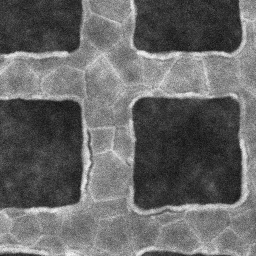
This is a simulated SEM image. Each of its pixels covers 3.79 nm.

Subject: holes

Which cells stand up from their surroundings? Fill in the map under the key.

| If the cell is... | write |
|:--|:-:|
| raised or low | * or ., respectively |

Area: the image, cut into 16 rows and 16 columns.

.....***.......*
.....***.......*
.....***.......*
****************
****************
****************
.....***.......*
.....***.......*
.....***.......*
.....***.......*
.....***.......*
.....***.......*
.....***.......*
****************
****************
****************